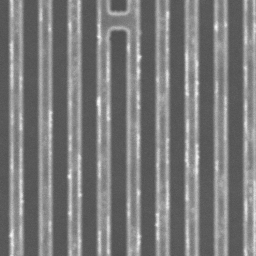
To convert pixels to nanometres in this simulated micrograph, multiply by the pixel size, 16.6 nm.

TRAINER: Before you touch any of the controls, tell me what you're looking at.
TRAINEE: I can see parallel lines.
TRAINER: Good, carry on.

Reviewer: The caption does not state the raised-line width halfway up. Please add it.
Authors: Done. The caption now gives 205 nm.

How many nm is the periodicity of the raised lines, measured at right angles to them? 484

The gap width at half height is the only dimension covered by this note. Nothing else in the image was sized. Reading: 292 nanometres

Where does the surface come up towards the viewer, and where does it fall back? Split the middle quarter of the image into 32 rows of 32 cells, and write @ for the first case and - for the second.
-@@@-----@@-----@@@----@@@-----@
-@@@-----@@-----@@@----@@@-----@
-@@@-----@@-----@@@----@@@-----@
-@@@-----@@-----@@@----@@@-----@
-@@@-----@@-----@@@----@@@----@@
-@@@-----@@-----@@@----@@@----@@
-@@@-----@@-----@@@----@@@-----@
-@@@-----@@-----@@@----@@@-----@
-@@@-----@@-----@@@----@@@-----@
-@@@----@@@-----@@@----@@@-----@
-@@@----@@@-----@@@----@@@-----@
-@@@-----@@-----@@@----@@@-----@
-@@@-----@@-----@@@----@@@-----@
-@@@-----@@-----@@@----@@@-----@
-@@@-----@@-----@@@----@@@-----@
-@@@-----@@-----@@@----@@@-----@
-@@@-----@@-----@@@----@@@-----@
-@@@-----@@-----@@@----@@@-----@
-@@@-----@@-----@@@----@@@-----@
-@@@-----@@-----@@@----@@@----@@
-@@@-----@@-----@@@----@@@-----@
-@@@-----@@-----@@@----@@@-----@
-@@@-----@@-----@@@----@@@-----@
-@@@-----@@-----@@@----@@@-----@
-@@@-----@@-----@@@----@@@----@@
-@@@-----@@-----@@@----@@@-----@
-@@@-----@@-----@@@----@@@-----@
-@@@-----@@-----@@@----@@@-----@
-@@@-----@@-----@@@----@@@-----@
-@@@-----@@-----@@@----@@@-----@
-@@@-----@@-----@@@----@@@-----@
-@@@-----@@-----@@@----@@@-----@